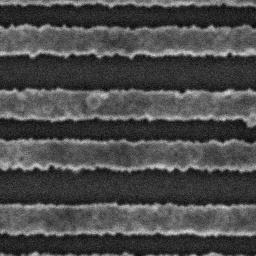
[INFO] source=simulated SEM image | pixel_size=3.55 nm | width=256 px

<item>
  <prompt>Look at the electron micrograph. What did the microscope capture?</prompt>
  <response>lines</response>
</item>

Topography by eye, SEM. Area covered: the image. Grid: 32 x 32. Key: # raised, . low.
..#..##..#...##..#####..########
................................
................................
.#########..###...#.#####.#####.
################################
################################
################################
................................
................................
................................
................................
##################.###.###..####
################################
################################
################################
...............................#
................................
..##..#.##...................#..
################################
################################
################################
................................
................................
................................
................................
.............#.....#............
################################
################################
################################
................................
................................
................................